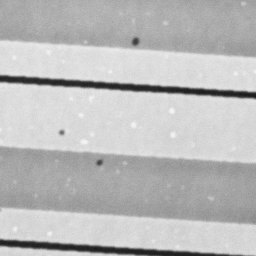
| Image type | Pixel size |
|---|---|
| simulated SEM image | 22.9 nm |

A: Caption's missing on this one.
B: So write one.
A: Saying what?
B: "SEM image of lines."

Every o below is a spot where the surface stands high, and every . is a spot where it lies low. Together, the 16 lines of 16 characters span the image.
................
................
................
oooooooooooooo..
oooooooooooooooo
oooooooooooooooo
oooooooooooooooo
oooooooooooooooo
oooooooooooooooo
......oooooooooo
................
................
................
ooooooo.........
oooooooooooooooo
oooooooooooooooo